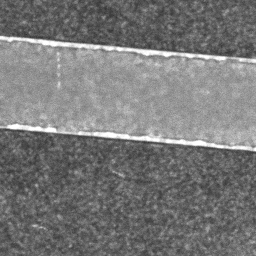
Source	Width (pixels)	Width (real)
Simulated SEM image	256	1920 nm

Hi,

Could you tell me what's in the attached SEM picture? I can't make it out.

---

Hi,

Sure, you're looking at one or a few lines or trenches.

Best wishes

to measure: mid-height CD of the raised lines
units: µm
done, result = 0.675